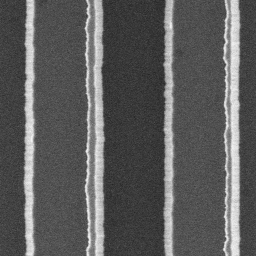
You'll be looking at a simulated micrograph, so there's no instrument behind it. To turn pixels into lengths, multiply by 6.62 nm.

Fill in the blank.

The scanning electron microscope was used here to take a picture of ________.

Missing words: lines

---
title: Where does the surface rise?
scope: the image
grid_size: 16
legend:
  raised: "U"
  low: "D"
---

DDUUUUDDDDDUUUUD
DDUUUUDDDDDUUUUD
DDUUUUDDDDDUUUUD
DDUUUUDDDDDUUUUD
DDUUUUDDDDDUUUUD
DDUUUUDDDDDUUUUD
DDUUUUDDDDDUUUUD
DDUUUUDDDDDUUUUD
DDUUUUDDDDDUUUUD
DDUUUUDDDDDUUUUD
DDUUUUDDDDDUUUUD
DDUUUUDDDDDUUUUD
DDUUUUDDDDDUUUUD
DDUUUUDDDDDUUUUD
DDUUUUDDDDDUUUUD
DDUUUUDDDDDUUUUD